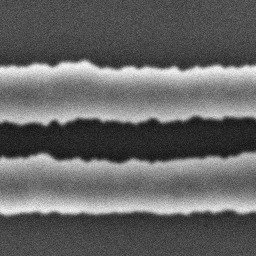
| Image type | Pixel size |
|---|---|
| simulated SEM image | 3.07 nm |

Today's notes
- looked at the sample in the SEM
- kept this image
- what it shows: lines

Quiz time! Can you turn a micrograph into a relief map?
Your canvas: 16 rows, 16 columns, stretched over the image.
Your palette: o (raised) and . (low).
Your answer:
................
................
................
................
oooooooooooooooo
oooooooooooooooo
oooooooooooooooo
oooo...oo.o.....
................
................
oooooooooooooooo
oooooooooooooooo
oooooooooooooooo
................
................
................